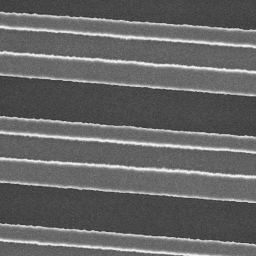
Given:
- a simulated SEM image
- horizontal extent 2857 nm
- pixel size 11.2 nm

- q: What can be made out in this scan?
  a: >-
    lines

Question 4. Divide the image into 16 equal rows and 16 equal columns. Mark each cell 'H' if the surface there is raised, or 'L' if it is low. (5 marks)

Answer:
LLLLLLLLLLLLLLLL
HHHHHHHHHHHLLLLL
HHHHHHHHHHHHHHHH
HHHHHHHHHHHHHHHH
HHHHHHHHHHHHHHHH
LLLLLLLLLLHHHHHH
LLLLLLLLLLLLLLLL
HHHLLLLLLLLLLLLL
HHHHHHHHHHHHHHHL
HHHHHHHHHHHHHHHH
HHHHHHHHHHHHHHHH
LHHHHHHHHHHHHHHH
LLLLLLLLLLLLLLHH
LLLLLLLLLLLLLLLL
HHHHHHLLLLLLLLLL
HHHHHHHHHHHHHHHH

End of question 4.